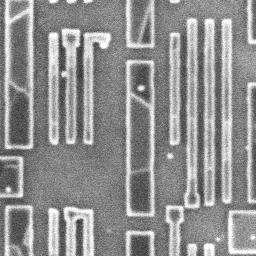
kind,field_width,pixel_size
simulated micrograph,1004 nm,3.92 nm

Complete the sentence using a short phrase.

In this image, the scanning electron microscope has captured wiring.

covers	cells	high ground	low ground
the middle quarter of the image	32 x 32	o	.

.oo..oo.........oooooo.....oo..o
.oo..oo.........oooooo.....oo..o
.oo..oo.........oooooo.....oo..o
.oo..oo.........oooooo.....oo..o
.oo..oo.........oooooo.....oo..o
.oo..oo.........oooooo.....oo..o
.oo..oo.........oooooo.....oo..o
.oo..oo.........oooooo.....oo..o
.oo..oo.........oooooo.....oo..o
.oo..oo.........oooooo.....oo..o
.oo..oo.........oooooo.....oo..o
.oo..oo.........oooooo.....oo..o
.oo..oo.........oooooo.....oo..o
.oo..oo.........oooooo.....oo..o
.oo..oo.........oooooo.....oo..o
.oo..oo.........oooooo.....oo..o
.oo..oo.........oooooo.....oo..o
.oo..oo.........oooooo.....oo..o
.oo..oo.........oooooo.....oo..o
.o...oo.........oooooo.....oo..o
................oooooo.........o
................oooooo.........o
................oooooo.........o
................oooooo.........o
................oooooo.........o
................oooooo.........o
................oooooo.........o
................oooooo.........o
................oooooo.........o
................oooooo.........o
................oooooo.........o
................oooooo.........o